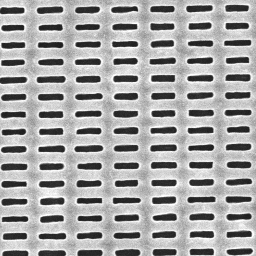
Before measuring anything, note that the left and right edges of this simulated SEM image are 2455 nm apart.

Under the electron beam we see a regular array of holes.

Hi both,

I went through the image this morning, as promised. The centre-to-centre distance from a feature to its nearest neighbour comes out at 164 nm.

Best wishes